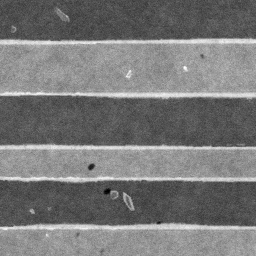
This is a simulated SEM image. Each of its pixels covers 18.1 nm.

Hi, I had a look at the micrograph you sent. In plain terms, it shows lines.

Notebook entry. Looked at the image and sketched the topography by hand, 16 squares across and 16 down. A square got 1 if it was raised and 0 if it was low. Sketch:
0000000000000000
0000000000000000
0000000000000000
1111111111111111
1111111111111111
1111111111111111
0000000000000000
0000000000000000
0000000000000000
1111111111111111
1111111111111111
0000000000000000
0000000000000000
0000000000000000
1111111111111111
1111111111111111